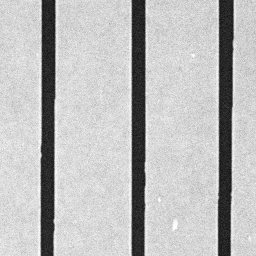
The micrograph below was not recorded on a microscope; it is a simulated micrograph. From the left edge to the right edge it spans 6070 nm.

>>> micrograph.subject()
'lines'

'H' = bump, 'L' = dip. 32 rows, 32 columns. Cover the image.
HHHHHLLHHHHHHHHHLLHHHHHHHHHLLHHH
HHHHHLLHHHHHHHHHLLHHHHHHHHHLLHHH
HHHHHLLHHHHHHHHHLLHHHHHHHHHLLHHH
HHHHHLLHHHHHHHHHLLHHHHHHHHHLLHHH
HHHHHLLHHHHHHHHHLLHHHHHHHHHLLHHH
HHHHHLLHHHHHHHHHLLHHHHHHHHHLLHHH
HHHHHLLHHHHHHHHHLLHHHHHHHHHLLHHH
HHHHHLLHHHHHHHHHLLHHHHHHHHHLLHHH
HHHHHLLHHHHHHHHHLLHHHHHHHHHLLHHH
HHHHHLLHHHHHHHHHLLHHHHHHHHHLLHHH
HHHHHLLHHHHHHHHHLLHHHHHHHHHLLHHH
HHHHHLLHHHHHHHHHLLHHHHHHHHHLLHHH
HHHHHLLHHHHHHHHHLLHHHHHHHHHLLHHH
HHHHHLLHHHHHHHHHLLHHHHHHHHHLLHHH
HHHHHLLHHHHHHHHHLLHHHHHHHHHLLHHH
HHHHHLLHHHHHHHHHLLHHHHHHHHHLLHHH
HHHHHLLHHHHHHHHHLLHHHHHHHHHLLHHH
HHHHHLLHHHHHHHHHLLHHHHHHHHHLLHHH
HHHHHLLHHHHHHHHHLLHHHHHHHHHLLHHH
HHHHHLLHHHHHHHHHLLHHHHHHHHHLLHHH
HHHHHLLHHHHHHHHHLLHHHHHHHHHLLHHH
HHHHHLLHHHHHHHHHLLHHHHHHHHHLLHHH
HHHHHLLHHHHHHHHHLLHHHHHHHHHLLHHH
HHHHHLLHHHHHHHHHLLHHHHHHHHHLLHHH
HHHHHLLHHHHHHHHHLLHHHHHHHHHLLHHH
HHHHHLLHHHHHHHHHLLHHHHHHHHHLLHHH
HHHHHLLHHHHHHHHHLLHHHHHHHHHLLHHH
HHHHHLLHHHHHHHHHLLHHHHHHHHHLLHHH
HHHHHLLHHHHHHHHHLLHHHHHHHHHLLHHH
HHHHHLLHHHHHHHHHLLHHHHHHHHHLLHHH
HHHHHLLHHHHHHHHHLLHHHHHHHHHLLHHH
HHHHHLLHHHHHHHHHLLHHHHHHHHHLLHHH